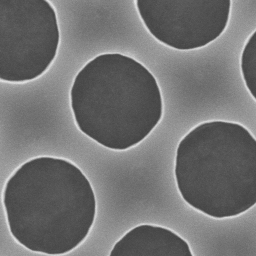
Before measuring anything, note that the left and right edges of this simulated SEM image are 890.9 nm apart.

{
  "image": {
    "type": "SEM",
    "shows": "holes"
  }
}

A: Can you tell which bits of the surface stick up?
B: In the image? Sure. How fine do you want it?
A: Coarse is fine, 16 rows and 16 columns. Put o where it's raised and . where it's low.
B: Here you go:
...oooooo.....oo
....ooooo.....oo
....oooooo...ooo
...ooo..ooooooo.
...oo....oooooo.
ooooo.....oooooo
oooo......oooooo
ooooo.....oooooo
oooooo...ooo....
ooooooooooo.....
o....oooooo.....
......ooooo.....
......oooooo....
......ooooooo.oo
o.....oo...ooooo
oo...oo.....oooo